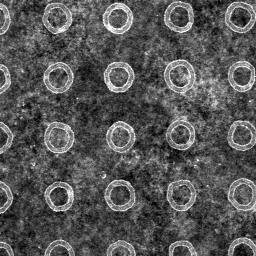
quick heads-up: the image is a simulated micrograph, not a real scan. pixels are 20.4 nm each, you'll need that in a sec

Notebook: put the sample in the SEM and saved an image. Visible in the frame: a regular array of ring-shaped raised bodies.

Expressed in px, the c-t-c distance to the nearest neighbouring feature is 59.7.